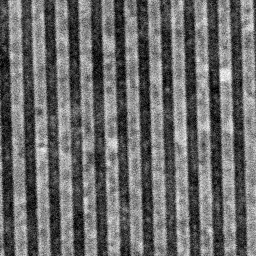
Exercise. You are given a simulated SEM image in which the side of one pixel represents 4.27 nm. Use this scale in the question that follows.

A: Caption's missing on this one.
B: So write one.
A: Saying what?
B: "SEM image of parallel lines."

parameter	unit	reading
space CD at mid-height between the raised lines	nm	55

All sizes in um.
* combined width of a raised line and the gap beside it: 0.0991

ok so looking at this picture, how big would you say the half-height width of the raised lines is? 9.86 px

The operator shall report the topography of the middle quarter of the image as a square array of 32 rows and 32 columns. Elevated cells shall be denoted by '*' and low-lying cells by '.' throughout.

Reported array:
*...***...***...**....**....**..
*...***...***...**....**....**..
*...***...***...**....**....**..
*...***...***...**....**....**..
*...***...***...**....**....**..
*....**...***...**....**....**..
*....**...***...**....**....**..
*....**...***...**....**....**..
*....**....**...**....**....**..
*....**....**...**....**....**..
*....**....**...***...**....**..
*....**....**...***...**....**..
*....**....**...***...**....**..
*....**....**...***...**....**..
*....**....**...***...**....**..
*....**....**...***...**....**..
*....**....**...***...**....**..
*....**....**...***...***...**..
*....**....**...***...***...**..
*....**....**...***...***...**..
*....**....**....**...***...**..
*....**....**....**...***...**..
**...**....**....**...***...**..
**...**....**....**...***...**..
**...**....**....**...***...**..
**...**....**....**...***...***.
**...**....**....**...***...***.
**...**....**....**...***...***.
**...**....**....**...***...***.
**...**....**....**...***...***.
**...**....**....**...***...***.
**...**....**....**...***...***.